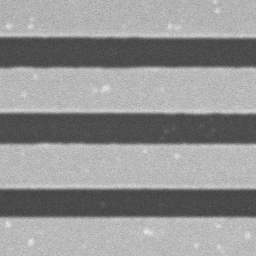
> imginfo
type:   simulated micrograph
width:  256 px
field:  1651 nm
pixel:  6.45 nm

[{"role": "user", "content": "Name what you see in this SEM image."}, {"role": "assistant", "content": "lines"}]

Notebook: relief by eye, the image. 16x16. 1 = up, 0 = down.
1111111111111111
1111111111111111
0000000000000000
0000000000000000
1111111111111111
1111111111111111
1111111111111111
0000000000000000
0000000000000000
1111111111111111
1111111111111111
1111111111111111
0000000000000000
0000000000000000
1111111111111111
1111111111111111